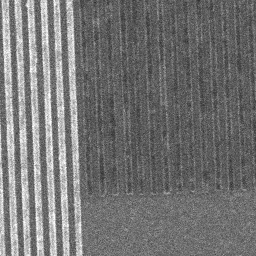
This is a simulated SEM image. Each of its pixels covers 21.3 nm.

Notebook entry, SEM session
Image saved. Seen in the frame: parallel lines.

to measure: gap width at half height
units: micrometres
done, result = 0.171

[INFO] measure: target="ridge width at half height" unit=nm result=106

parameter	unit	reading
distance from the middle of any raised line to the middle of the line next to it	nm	274